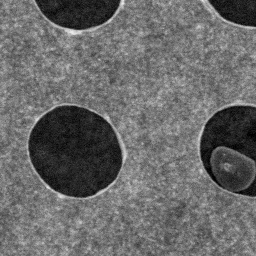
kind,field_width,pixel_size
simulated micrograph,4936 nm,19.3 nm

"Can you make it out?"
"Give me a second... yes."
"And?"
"holes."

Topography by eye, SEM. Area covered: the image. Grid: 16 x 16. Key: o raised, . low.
oo.....oooooo...
ooo...ooooooooo.
oooooooooooooooo
oooooooooooooooo
oooooooooooooooo
oooooooooooooooo
oooooooooooooooo
oo.....oooooo...
oo.....oooooo...
oo......ooooo...
oo......ooooo...
ooo....ooooooo..
oooooooooooooooo
oooooooooooooooo
oooooooooooooooo
oooooooooooooooo